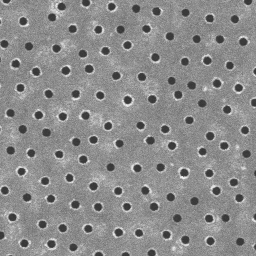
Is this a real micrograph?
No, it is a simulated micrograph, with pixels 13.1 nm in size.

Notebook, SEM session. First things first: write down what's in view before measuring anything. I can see a regular array of holes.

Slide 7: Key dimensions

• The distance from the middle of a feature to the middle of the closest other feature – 0.273 micrometres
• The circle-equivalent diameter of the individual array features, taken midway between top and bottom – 110 nanometers